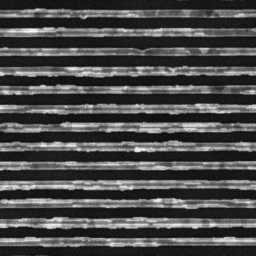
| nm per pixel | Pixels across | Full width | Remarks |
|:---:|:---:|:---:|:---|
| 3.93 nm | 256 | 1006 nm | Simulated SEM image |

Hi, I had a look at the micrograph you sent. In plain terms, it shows parallel lines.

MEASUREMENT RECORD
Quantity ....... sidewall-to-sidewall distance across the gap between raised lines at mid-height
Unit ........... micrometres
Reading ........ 0.0442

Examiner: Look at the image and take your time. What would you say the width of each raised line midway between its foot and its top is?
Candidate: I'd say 29.9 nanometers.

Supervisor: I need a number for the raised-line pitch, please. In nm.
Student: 74.8